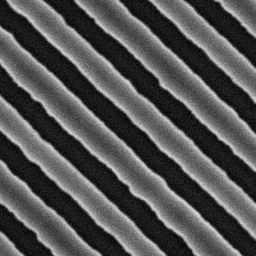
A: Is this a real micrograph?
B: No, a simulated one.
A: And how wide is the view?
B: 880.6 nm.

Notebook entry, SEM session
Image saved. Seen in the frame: lines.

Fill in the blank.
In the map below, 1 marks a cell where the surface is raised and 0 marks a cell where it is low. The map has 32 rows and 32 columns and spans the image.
01111100001111100001111100001111
00111110000111110000111100000111
00001111000011111000011111000011
00001111100001111100001111100001
11000111110000111110000111110000
11000001111000011111000011111000
11100000111100001111110000111100
11110000011110000111111000011110
01111100001111000011111100001111
01111110000111100001111110000111
00111111000011110000111111000011
00011111100001111000011111100001
00000111110000111100001111110000
11000011111000011110000011111000
11100011111100001111000011111100
11110000111110000111110000111110
11110000111111000011111000011111
01111000001111100001111100001111
00011110000111110000111110000111
00011111000011111000011111000011
10000111100001111100001111100001
10000011110000111110000111110000
11100001111000011111000011111000
11110000111100001111100001111100
11110000011110000111110000011110
11111100001111000001111100011111
01111110000111100001111110000111
00111111000011110000111110000011
00001111100001111000011111100001
10000111110000111100000111110000
11000111111000011110000111111000
11000001111100001111000011111100